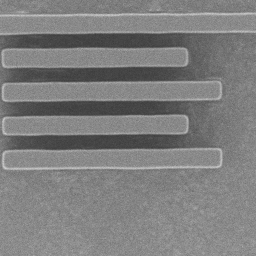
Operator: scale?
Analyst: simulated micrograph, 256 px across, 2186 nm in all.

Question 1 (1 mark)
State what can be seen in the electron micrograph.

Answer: groups of lines, slits or small figures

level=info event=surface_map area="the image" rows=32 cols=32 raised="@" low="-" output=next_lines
--------------------------------
--------------------------------
@@@@@@@@@@@@@@@@@@@@@@@@@@@@@@@@
@@@@@@@@@@@@@@@@@@@@@@@@@@@@@@@@
--------------------------------
--------------------------------
@@@@@@@@@@@@@@@@@@@@@@@---------
@@@@@@@@@@@@@@@@@@@@@@@---------
--------------------------------
--------------------------------
-@@@@@@@@@@@@@@@@@@@@@@@@@@@----
@@@@@@@@@@@@@@@@@@@@@@@@@@@@----
-@@@@@@@@---@@------------------
--------------------------------
------@@@@@@@@@@@@@@@@@---------
@@@@@@@@@@@@@@@@@@@@@@@---------
-@@@@@@@@@@@@@@@@@@@@@@---------
--------------------------------
--------------------------------
@@@@@@@@@@@@@@@@@@@@@@@@@@@@----
@@@@@@@@@@@@@@@@@@@@@@@@@@@@----
--------------------------------
--------------------------------
--------------------------------
--------------------------------
--------------------------------
--------------------------------
--------------------------------
--------------------------------
--------------------------------
--------------------------------
--------------------------------